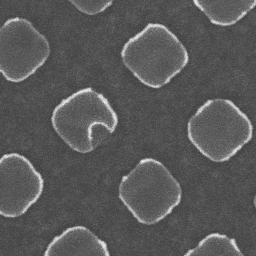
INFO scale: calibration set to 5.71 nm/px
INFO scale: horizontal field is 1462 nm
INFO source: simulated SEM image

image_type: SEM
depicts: raised bodies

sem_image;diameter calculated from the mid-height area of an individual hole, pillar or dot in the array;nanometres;343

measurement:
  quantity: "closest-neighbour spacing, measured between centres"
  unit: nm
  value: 539